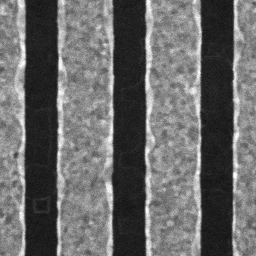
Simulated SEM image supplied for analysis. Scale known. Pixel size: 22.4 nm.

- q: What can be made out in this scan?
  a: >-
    wiring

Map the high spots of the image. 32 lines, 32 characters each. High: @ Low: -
@@@-----@@@@@------@@@@@------@@
@@@-----@@@@@@-----@@@@@@-----@@
@@@-----@@@@@@-----@@@@@@-----@@
@@@-----@@@@@@-----@@@@@@-----@@
@@@-----@@@@@@-----@@@@@@-----@@
@@@-----@@@@@@-----@@@@@@-----@@
@@@-----@@@@@@-----@@@@@@-----@@
@@@-----@@@@@@-----@@@@@@-----@@
@@@-----@@@@@@-----@@@@@@----@@@
@@------@@@@@@----@@@@@@@----@@@
@@------@@@@@@----@@@@@@@----@@@
@@@-----@@@@@@-----@@@@@-----@@@
@@@----@@@@@@@-----@@@@@@-----@@
@@@-----@@@@@@-----@@@@@@-----@@
@@@-----@@@@@@-----@@@@@@-----@@
@@@-----@@@@@@-----@@@@@@-----@@
@@@-----@@@@@@-----@@@@@@-----@@
@@@-----@@@@@@-----@@@@@@----@@@
@@@----@@@@@@@-----@@@@@@----@@@
@@@----@@@@@@@----@@@@@@@----@@@
@@@----@@@@@@@----@@@@@@@-----@@
@@@----@@@@@@------@@@@@@-----@@
@@@-----@@@@@------@@@@@@----@@@
@@@-----@@@@@@-----@@@@@-----@@@
@@@-----@@@@@@-----@@@@@@----@@@
@@@----@@@@@@@----@@@@@@@----@@@
@@@----@@@@@@@----@@@@@@@----@@@
@@@----@@@@@@@-----@@@@@@----@@@
@@@----@@@@@@@----@@@@@@@----@@@
@@@----@@@@@@@----@@@@@@@----@@@
@@@----@@@@@@@-----@@@@@@----@@@
@@@----@@@@@@@-----@@@@@-----@@@